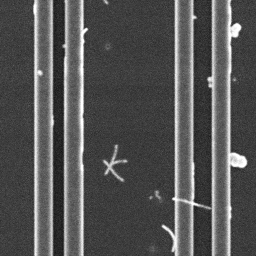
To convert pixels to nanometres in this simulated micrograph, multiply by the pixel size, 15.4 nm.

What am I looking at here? lines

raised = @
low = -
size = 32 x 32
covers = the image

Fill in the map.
----@@--@@------------@@---@@---
----@@--@@------------@@---@@---
----@@--@@------------@@---@@---
----@@--@@@-----------@@---@@---
----@@--@@------------@@---@@---
----@@--@@------------@@---@@---
----@@--@@------------@@---@@---
----@@--@@------------@@---@@---
----@@--@@------------@@---@@---
----@@--@@------------@@---@@---
----@@--@@------------@@---@@---
----@@--@@------------@@---@@---
----@@--@@------------@@---@@---
----@@--@@------------@@---@@---
----@@--@@------------@@---@@---
----@@@-@@------------@@---@@---
----@@--@@------------@@---@@---
----@@--@@------------@@---@@---
----@@--@@------------@@---@@---
----@@--@@------------@@---@@---
----@@--@@------------@@---@@---
----@@--@@------------@@---@@---
----@@--@@------------@@---@@---
----@@--@@------------@@---@@---
----@@--@@------------@@---@@---
----@@--@@------------@@---@@---
----@@--@@------------@@---@@---
----@@--@@------------@@---@@---
----@@--@@------------@@---@@---
----@@--@@------------@@---@@---
----@@--@@------------@@---@@---
----@@--@@------------@@---@@---